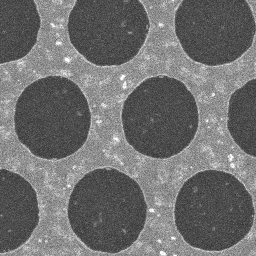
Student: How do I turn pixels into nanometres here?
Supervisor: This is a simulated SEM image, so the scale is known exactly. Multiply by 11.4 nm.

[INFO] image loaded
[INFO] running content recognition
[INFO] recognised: holes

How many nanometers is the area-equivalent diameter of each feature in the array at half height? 920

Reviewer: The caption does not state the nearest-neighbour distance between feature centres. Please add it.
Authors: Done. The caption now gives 1210 nm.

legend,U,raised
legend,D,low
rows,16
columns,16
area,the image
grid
DDUUUDDDDUUDDDDD
DDDUDDDDDUUDDDDD
DDUUDDDDDUUDDDDD
DDUUUDDDUUUUDDDU
UUUUUUUUUUUUUUUU
UUDDDUUUDDDDUUUD
UDDDDUUUDDDDUUDD
UDDDDDUUDDDDUUDD
UDDDDUUUDDDDUUDD
UUDDDUUUUDDUUUUD
UUUUUUDUUUUUUUUU
DDUUUDDDDUUDDDDU
DDUUDDDDDUUDDDDD
DDUUDDDDDUUDDDDD
DDUUUDDDDUUDDDDD
DUUUUUDDUUUUDDUU